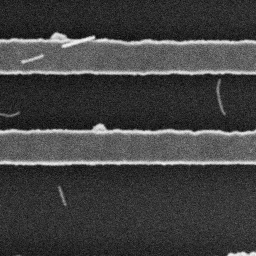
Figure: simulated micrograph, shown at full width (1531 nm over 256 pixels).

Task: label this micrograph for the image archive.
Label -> lines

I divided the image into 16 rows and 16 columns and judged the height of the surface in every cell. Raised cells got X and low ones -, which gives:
----------------
----------------
XXXXXXX---------
XXXXXXXXXXXXXXXX
XXXXXXXXXXXXXXXX
----------------
----------------
----------------
XXXXXXXXXXXXXXXX
XXXXXXXXXXXXXXXX
----------------
----------------
----------------
----------------
----------------
----------------